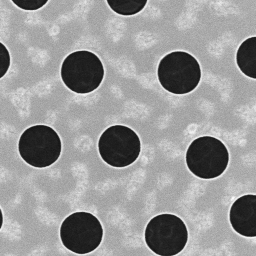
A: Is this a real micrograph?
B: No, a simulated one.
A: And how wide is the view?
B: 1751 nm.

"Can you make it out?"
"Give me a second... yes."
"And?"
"holes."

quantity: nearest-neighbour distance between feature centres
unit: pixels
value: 86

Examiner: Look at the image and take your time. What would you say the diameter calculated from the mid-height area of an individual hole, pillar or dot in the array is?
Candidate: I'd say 292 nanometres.